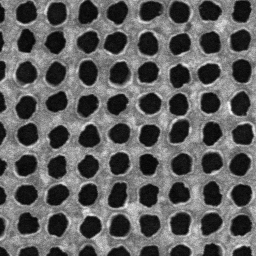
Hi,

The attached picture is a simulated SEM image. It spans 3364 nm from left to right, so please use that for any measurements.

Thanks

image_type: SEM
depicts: a regular array of holes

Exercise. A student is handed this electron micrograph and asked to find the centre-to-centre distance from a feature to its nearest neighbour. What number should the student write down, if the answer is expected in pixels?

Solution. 29.2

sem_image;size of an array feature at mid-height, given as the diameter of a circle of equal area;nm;292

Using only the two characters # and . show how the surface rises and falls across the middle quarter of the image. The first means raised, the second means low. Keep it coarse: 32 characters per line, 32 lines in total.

####....####....###....#####..##
.###.....##......#......##.....#
.##......##......#......##.....#
####....###.....###.....##......
#####...####....###...#####....#
###########################...##
################################
######.######..######..#####..##
.###....###.....###.....###....#
.###.....##.....###......#.....#
.##......##.....###......#.....#
###.....###....####.....##.....#
###....#####..######..#####....#
#####.##########################
############################...#
######..####....####...####....#
.####...###......##.....###....#
.###.....##......##.....##.....#
.###.....##.....###.....##.....#
.##......###....###....####..###
####....############..##########
################################
############....####..#######..#
#####...####....###....####.....
.###.....##......##.....###.....
.##......##......##....####.....
.##......###....###....####.....
.###....####..######...#####...#
#####..#########################
#############..#############.###
#####...####....####...####...##
.###....####....###.....##.....#